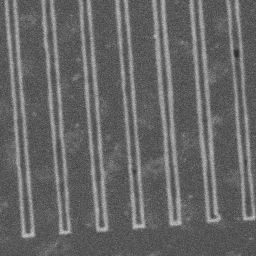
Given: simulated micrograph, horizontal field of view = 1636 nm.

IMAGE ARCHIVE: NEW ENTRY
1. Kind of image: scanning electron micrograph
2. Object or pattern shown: parallel lines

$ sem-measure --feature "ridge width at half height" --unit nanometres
58.9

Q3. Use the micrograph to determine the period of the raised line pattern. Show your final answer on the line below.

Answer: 236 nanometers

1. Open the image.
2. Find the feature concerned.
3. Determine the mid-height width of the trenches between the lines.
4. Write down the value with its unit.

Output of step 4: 177 nanometres